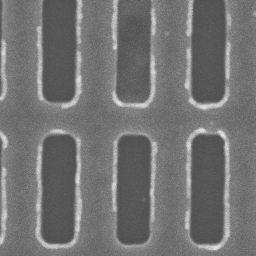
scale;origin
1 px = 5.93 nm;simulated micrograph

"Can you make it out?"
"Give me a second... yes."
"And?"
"holes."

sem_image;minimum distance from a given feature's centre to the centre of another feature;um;0.442